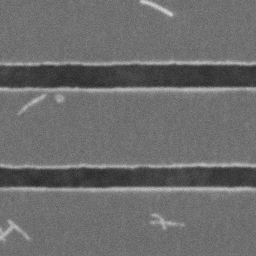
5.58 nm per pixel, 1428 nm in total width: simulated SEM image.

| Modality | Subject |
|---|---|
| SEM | lines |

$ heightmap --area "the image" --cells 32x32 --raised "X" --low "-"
XXXXXXXXXXXXXXXXXXXXXXXXXXXXXXXX
XXXXXXXXXXXXXXXXXXXXXXXXXXXXXXXX
XXXXXXXXXXXXXXXXXXXXXXXXXXXXXXXX
XXXXXXXXXXXXXXXXXXXXXXXXXXXXXXXX
XXXXXXXXXXXXXXXXXXXXXXXXXXXXXXXX
XXXXXXXXXXXXXXXXXXXXXXXXXXXXXXXX
XXXXXXXXXXXXXXXXXXXXXXXXXXXXXXXX
XXXXXXXXXXXXXXXXXXXXXXXXXXXXXXXX
--------------------------------
--------------------------------
--------------------------------
XXXXXXXXXXXXXXXXXXXXXXXXXXXXXXXX
XXXXXXXXXXXXXXXXXXXXXXXXXXXXXXXX
XXXXXXXXXXXXXXXXXXXXXXXXXXXXXXXX
XXXXXXXXXXXXXXXXXXXXXXXXXXXXXXXX
XXXXXXXXXXXXXXXXXXXXXXXXXXXXXXXX
XXXXXXXXXXXXXXXXXXXXXXXXXXXXXXXX
XXXXXXXXXXXXXXXXXXXXXXXXXXXXXXXX
XXXXXXXXXXXXXXXXXXXXXXXXXXXXXXXX
XXXXXXXXXXXXXXXXXXXXXXXXXXXXXXXX
XXXXXXXXXXXXXXXXXXXXXXXXXXXXXXXX
--------------------------------
--------------------------------
-XXXX---------XXXXXXXXXXXXXX-XXX
XXXXXXXXXXXXXXXXXXXXXXXXXXXXXXXX
XXXXXXXXXXXXXXXXXXXXXXXXXXXXXXXX
XXXXXXXXXXXXXXXXXXXXXXXXXXXXXXXX
XXXXXXXXXXXXXXXXXXXXXXXXXXXXXXXX
XXXXXXXXXXXXXXXXXXXXXXXXXXXXXXXX
XXXXXXXXXXXXXXXXXXXXXXXXXXXXXXXX
XXXXXXXXXXXXXXXXXXXXXXXXXXXXXXXX
XXXXXXXXXXXXXXXXXXXXXXXXXXXXXXXX